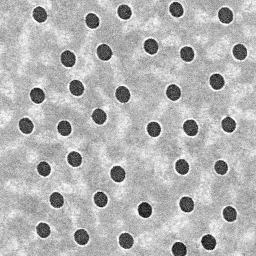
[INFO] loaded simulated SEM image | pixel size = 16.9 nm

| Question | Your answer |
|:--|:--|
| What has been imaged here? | a regular array of holes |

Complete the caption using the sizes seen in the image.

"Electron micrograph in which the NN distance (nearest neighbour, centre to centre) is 591 nm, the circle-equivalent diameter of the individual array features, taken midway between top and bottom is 272 nanometers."